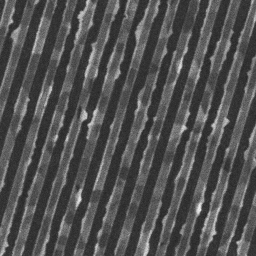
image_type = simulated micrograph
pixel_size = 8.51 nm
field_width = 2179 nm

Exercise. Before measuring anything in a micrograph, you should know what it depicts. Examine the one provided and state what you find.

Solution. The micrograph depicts parallel lines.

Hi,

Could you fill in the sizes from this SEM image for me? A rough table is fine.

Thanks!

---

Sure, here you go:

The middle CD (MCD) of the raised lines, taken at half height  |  80.5 nanometres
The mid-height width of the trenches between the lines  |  80.5 nm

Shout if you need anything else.